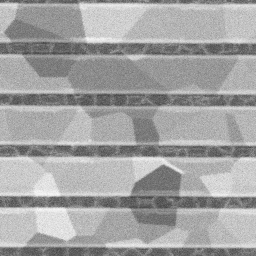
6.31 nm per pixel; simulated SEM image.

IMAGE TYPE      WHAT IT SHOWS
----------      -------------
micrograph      parallel lines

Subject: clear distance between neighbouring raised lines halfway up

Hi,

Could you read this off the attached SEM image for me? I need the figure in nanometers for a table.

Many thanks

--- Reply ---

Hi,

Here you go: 91.5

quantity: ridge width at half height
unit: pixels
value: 37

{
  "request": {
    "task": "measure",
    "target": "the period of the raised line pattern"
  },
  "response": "322 nm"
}